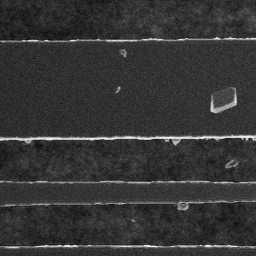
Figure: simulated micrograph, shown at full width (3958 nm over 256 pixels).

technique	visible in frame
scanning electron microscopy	lines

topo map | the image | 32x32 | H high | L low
LLLLLLLLLLLLLLLLLLLLLLLLLLLLLLLL
LLLLLLLLLLLLLLLLLLLLLLLLLLLLLLLL
LLLLLLLLLLLLLLLLLLLLLLLLLLLLLLLL
LLLLLLLLLLLLLLLLLLLLLLLLLLLLLLLL
LLLLLLLLLLLLLLLLLLLLLLLLLLLLLLLL
HHHHHHHHHHHHHHHHHHHHHHHHHHHHHHHH
HHHHHHHHHHHHHHHHHHHHHHHHHHHHHHHH
HHHHHHHHHHHHHHHHHHHHHHHHHHHHHHHH
HHHHHHHHHHHHHHHHHHHHHHHHHHHHHHHH
HHHHHHHHHHHHHHHHHHHHHHHHHHHHHHHH
HHHHHHHHHHHHHHHHHHHHHHHHHHHHHHHH
HHHHHHHHHHHHHHHHHHHHHHHHHHHHHHHH
HHHHHHHHHHHHHHHHHHHHHHHHHHHHHHHH
HHHHHHHHHHHHHHHHHHHHHHHHHHHHHHHH
HHHHHHHHHHHHHHHHHHHHHHHHHHHHHHHH
HHHHHHHHHHHHHHHHHHHHHHHHHHHHHHHH
HHHHHHHHHHHHHHHHHHHHHHHHHHHHHHHH
LLLLLLLLLLLLLLLLLLLLLLLLLLLLLLLL
LLLLLLLLLLLLLLLLLLLLLLLLLLLLLLLL
LLLLLLLLLLLLLLLLLLLLLLLLLLLLLLLL
LLLLLLLLLLLLLLLLLLLLLLLLLLLLLLLL
LLLLLLLLLLLLLLLLLLLLLLLLLLLLLLLL
LLLLLLLLLLLLLLLLLLLLLLLLLLLLLLLL
HHHHHHHHHHHHHHHHHHHHHHHHHHHHHHHH
HHHHHHHHHHHHHHHHHHHHHHHHHHHHHHHH
HHHHHHLLLLLLLLLLLLLLLLLLLLLLLLLL
LLLLLLLLLLLLLLLLLLLLLLLLLLLLLLLL
LLLLLLLLLLLLLLLLLLLLLLLLLLLLLLLL
LLLLLLLLLLLLLLLLLLLLLLLLLLLLLLLL
LLLLLLLLLLLLLLLLLLLLLLLLLLLLLLLL
LLLLLLLLLLLLLLLLLLLLLLLLLLLLLLLL
HHHHHHHHHHHHHHHHHHHHHHHHHHHHHHHH